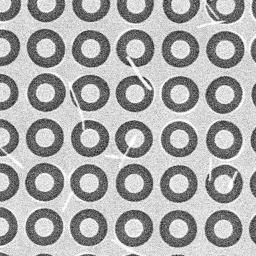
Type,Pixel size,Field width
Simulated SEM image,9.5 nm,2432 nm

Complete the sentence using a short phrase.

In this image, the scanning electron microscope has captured an array of small figures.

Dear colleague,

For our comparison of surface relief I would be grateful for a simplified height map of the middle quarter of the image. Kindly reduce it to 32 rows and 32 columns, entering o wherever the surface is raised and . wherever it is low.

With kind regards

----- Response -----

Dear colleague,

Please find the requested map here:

oooo.....ooooooo.o..ooooooo....o
oooooooooooooooooooooooooooooooo
oooooooooooooooooooooooooooooooo
ooo.......ooooo....o.ooooo.....o
oo.........ooo........ooo.......
oo.........oo.........ooo.......
.o..........o..........o........
............o..........o........
oo.........oo..........o........
oo.........oo.........ooo.......
ooo.......oooo.......oooo.......
oooo.....oooooo.....oooooo......
oooooooooooooooooooooooooooooooo
oooooooooooooooooooooooooooooooo
ooooo....oooooo....oooooooo....o
ooo.......oooo.......oooo.......
oo.........oo.........ooo.......
oo.........oo.........oo........
oo..........o.........oo........
oo.........oo.........oo........
oo.........oo.........oo........
ooo.......oooo.......oooo.......
ooo......ooooo.......ooooo......
ooooooooooooooooo..ooooooooo.ooo
oooooooooooooooooooooooooooooooo
oooo....ooooooo.....ooooooo...oo
ooo.......oooo.......ooooo......
oo.........oo.........ooo.......
o..........oo.........oo........
o..........oo.........oo........
oo.........oo.........oo........
oo.........oo.........oo........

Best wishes